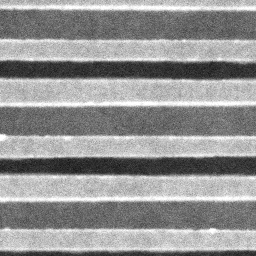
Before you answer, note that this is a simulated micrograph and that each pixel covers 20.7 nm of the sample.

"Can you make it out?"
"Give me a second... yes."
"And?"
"lines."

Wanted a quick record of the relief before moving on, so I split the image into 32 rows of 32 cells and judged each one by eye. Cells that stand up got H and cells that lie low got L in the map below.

HHHHHHHHHHHHHHHHHHHHHHHHHHHHHHHH
LLLLLLLLLLLLLLLLLLLLLLLLLLLLLLLL
LLLLLLLLLLLLLLLLLLLLLLLLLLLLLLLL
LLLLLLLLLLLLLLLLLLLLLLLLLLLLLLLL
LLLLLLLLLLLLLLLLLLLLLLLLLLLLLLLL
HHHHHHHHHHHHHHHHHHHHHHHHHHHHHHHH
HHHHHHHHHHHHHHHHHHHHHHHHHHHHHHHH
LLLLLLLLLLLLLLLLLLLLLLLLLLLLLHHH
LLLLLLLLLLLLLLLLLLLLLLLLLLLLLLLL
LLLLLLLLLLLLLLLLLLLLLLLLLLLLLLLL
HHHHHHHHHHHHHHHHHHHHHHHHHHHHHHHH
HHHHHHHHHHHHHHHHHHHHHHHHHHHHHHHH
HHHHHHHHHHHHHHHHHHHHHHHHHHHHHHHH
LLLLLLLLLLLLLLLLLLLLLLLLLLLLLLLL
LLLLLLLLLLLLLLLLLLLLLLLLLLLLLLLL
LLLLLLLLLLLLLLLLLLLLLLLLLLLLLLLL
LLLLLLLLLLLLLLLLLLLLLLLLLLLLLLLL
HHHHHHHHHHHHHHHHHHHHHHHHHHHHHHHH
HHHHHHHHHHHHHHHHHHHHHHHHHHHHHHHH
HHHHHHHHHHHLHLLLLLLLLLLLLLLLLLLL
LLLLLLLLLLLLLLLLLLLLLLLLLLLLLLLL
LLLLLLLLLLLLLLLLLLLLLLLLLLLLLLLL
HHHHHHHHHHHHHHHHHHHHHHHHHHHHHHHH
HHHHHHHHHHHHHHHHHHHHHHHHHHHHHHHH
HHHHHHHHHHHHHHHHHHHHHHHHHHHHHHHH
LLLLLLLLLLLLLLLLLLLLLLLLLLLLLLLL
LLLLLLLLLLLLLLLLLLLLLLLLLLLLLLLL
LLLLLLLLLLLLLLLLLLLLLLLLLLLLLLLL
LLLLLLLLLLLLLLLLLLLLLLLLLLLLLLLL
HHHHHHHHHHHHHHHHHHHHHHHHHHHHHHHH
HHHHHHHHHHHHHHHHHHHHHHHHHHHHHHHH
LLLLLLLLLLLLLLLLLLLLLLLLLLLLLLLL